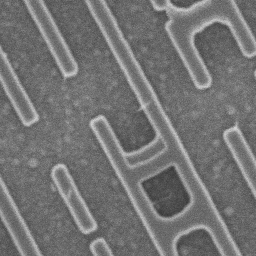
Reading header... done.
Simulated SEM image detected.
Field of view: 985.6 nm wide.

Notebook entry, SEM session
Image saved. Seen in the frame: parallel lines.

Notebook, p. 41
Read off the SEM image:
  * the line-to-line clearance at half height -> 162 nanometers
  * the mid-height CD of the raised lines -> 0.0623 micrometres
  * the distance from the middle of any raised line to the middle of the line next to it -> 217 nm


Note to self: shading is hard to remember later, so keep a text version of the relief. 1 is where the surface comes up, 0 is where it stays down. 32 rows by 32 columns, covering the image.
00011000000110000001100011111000
00001100000111000000011111111100
00001110000011000000011111111100
00000110000001100000011110000110
00000111000001100000011100000111
00000011000000110000001100000011
00000001100000110000001110000011
10000001100000011000000110000000
10000000110000011000000111000000
11000000000000001100000011000000
11000000000000001110000011000000
01100000000000000110000000000000
01110000000000000111000000000000
00110000000000000011000000000000
00111000000000000011100000000000
00010000000111000001100000000000
00000000000011000000110000001100
00000000000011100001110000001100
00000000000001100011111000000110
00000000000000111111111000000111
00000000000000111111111100000011
00000001000000011111001100000011
00000001100000011100000110000001
10000001100000001100000111000001
10000000110000001100000011000000
11000000111000000110000011100000
11000000011000000111000111100000
11100000011100000011111111110000
01100000001100000011111111110000
01110000000000000001111000111000
00110000000010000001110000011000
00011000000011000000110000001100